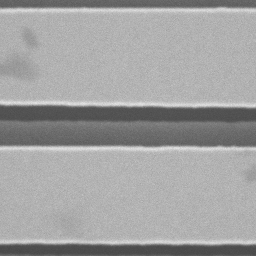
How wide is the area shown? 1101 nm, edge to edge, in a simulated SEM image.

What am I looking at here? lines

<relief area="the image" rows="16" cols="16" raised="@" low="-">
-------------@@-
@@@@@@@@@@@@@@@@
@@@@@@@@@@@@@@@@
@@@@@@@@@@@@@@@@
@@@@@@@@@@@@@@@@
@@@@@@@@@@@@@@@@
@@@@@@@@@@@@@@@@
----------------
----------------
@@@@@@@@@@@@@@@@
@@@@@@@@@@@@@@@@
@@@@@@@@@@@@@@@@
@@@@@@@@@@@@@@@@
@@@@@@@@@@@@@@@@
@@@@@@@@@@@@@@@@
----------------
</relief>